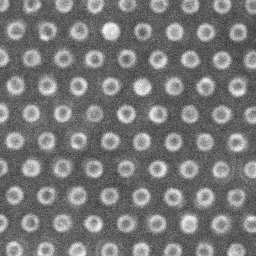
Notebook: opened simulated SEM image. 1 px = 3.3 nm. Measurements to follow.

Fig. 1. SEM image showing a regular array of raised bodies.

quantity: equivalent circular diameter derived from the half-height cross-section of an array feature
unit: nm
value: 51.1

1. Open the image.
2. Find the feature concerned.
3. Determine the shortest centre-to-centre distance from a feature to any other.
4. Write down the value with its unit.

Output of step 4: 103 nm